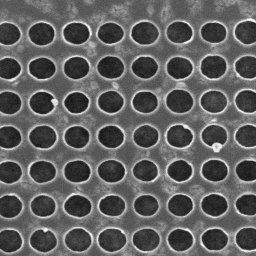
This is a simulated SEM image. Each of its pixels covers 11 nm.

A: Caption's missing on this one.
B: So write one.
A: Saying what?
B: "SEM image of a regular array of holes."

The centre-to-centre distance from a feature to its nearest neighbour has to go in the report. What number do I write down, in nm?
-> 372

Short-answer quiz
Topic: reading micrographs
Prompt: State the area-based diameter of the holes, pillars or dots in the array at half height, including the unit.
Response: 264 nm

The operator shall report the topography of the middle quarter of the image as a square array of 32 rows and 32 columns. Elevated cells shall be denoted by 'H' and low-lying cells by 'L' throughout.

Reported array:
LLLLLLHHLLLLLLLHHLLLLLLHHHLLLLLL
LLLLLLHHHLLLLLLHHLLLLLLLHHLLLLLL
LLLLLLHHHLLLLLHHHHLLLLLHHHLLLLLL
HLLLHHHHHHLLLLHHHHHLLHHHHHHLLLHH
HHHHHHHHHHHHHHHHHHHHHHHHHHHHHHHH
HHHHHHHHHHHHHHHHHHHHHHHHHHHHHHHH
HHHHHHHHHHHHHHHHHHHHHHHHHHHHLHHH
HLLLLHHHHLLLLLHHHHLLLLHHHHLLLLLL
LLLLLLHHHLLLLLLHHLLLLLLHHHLLLLLL
LLLLLLHHLLLLLLLHHLLLLLLLHLLLLLLL
LLLLLLHHHLLLLLLHHLLLLLLHHHLLLLLL
HLLLLHHHHHLLLLHHHHLLLLLHHHHLLLLH
HHHHHHHHHHHHHHHHHHHHHHHHHHHHHHHH
HHHHHHHHHHHHHHHHHHHHHHHHHHHHHHHH
HHHHHHHHHHHHHHHHHHHHHHHHHHHHHHHH
HHHLHHHHHHLLLHHHHHHLLLHHHHHLLLHH
HLLLLLHHHLLLLLHHHHLLLLLHHHLLLLLH
LLLLLLHHLLLLLLLHHLLLLLLLHHLLLLLL
LLLLLLHHLLLLLLLHHLLLLLLLHHLLLLLL
LLLLLLHHHLLLLLLHHHLLLLLHHHLLLLLL
HLLLLHHHHHLLLLHHHHHLLLHHHHHLLLLH
HHHHHHHHHHHHHHHHHHHHHHHHHHHHHHHH
HHHHHHHHHHHHHHHHHHHHHHHHHHHHHHHH
HHHHHHHHHHHHHHHHHHHHHHHHHHHHHHHH
HHLLLHHHHHLLLLHHHHLLLLHHHHHLLLLH
LLLLLLHHHLLLLLLHHHLLLLLHHHLLLLLL
LLLLLLLHLLLLLLLHHLLLLLLHHHLLLLLL
LLLLLLLHLLLLLLLHHLLLLLLHHHLLLLLL
HLLLLLHHHLLLLLLHHHLLLLLHHHHLLLLH
HHLLLHHHHHHLLHHHHHHHHHHHHHHHLHHH
HHHHHHHHHHHHHHHHHHHHHHHHHHHHHHHH
HHHHHHHHHHHHHHHHHHHHHHHHHHHHHHHH